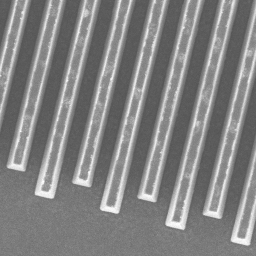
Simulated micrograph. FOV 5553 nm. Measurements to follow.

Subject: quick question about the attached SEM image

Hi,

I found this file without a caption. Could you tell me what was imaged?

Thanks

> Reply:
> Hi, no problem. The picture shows parallel lines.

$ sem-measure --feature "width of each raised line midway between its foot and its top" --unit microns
0.343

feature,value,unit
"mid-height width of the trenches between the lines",388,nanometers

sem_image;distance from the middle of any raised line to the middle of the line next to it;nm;728